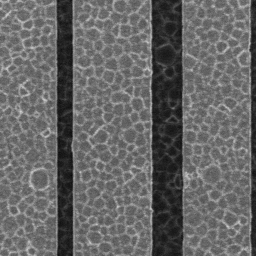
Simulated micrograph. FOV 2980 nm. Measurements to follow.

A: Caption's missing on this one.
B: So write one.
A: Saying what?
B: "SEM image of one or a few lines or trenches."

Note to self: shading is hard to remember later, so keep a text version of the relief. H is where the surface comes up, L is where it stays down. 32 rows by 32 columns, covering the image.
HHHHHHHLLHHHHHHHHHHLLLLHHHHHHHHL
HHHHHHHLLHHHHHHHHHHLLLLHHHHHHHHL
HHHHHHHLLHHHHHHHHHHLLLLHHHHHHHHL
HHHHHHHLLHHHHHHHHHHLLLLHHHHHHHHL
HHHHHHHLLHHHHHHHHHHLLLLHHHHHHHHL
HHHHHHHLLHHHHHHHHHHLLLLHHHHHHHHL
HHHHHHHLLHHHHHHHHHHLLLLHHHHHHHHL
HHHHHHHLLHHHHHHHHHHLLLLHHHHHHHHL
HHHHHHHLLHHHHHHHHHHLLLLHHHHHHHHL
HHHHHHHLLHHHHHHHHHHLLLLHHHHHHHHL
HHHHHHHLLHHHHHHHHHHLLLLHHHHHHHHL
HHHHHHHLLHHHHHHHHHHLLLLHHHHHHHHL
HHHHHHHLLHHHHHHHHHHLLLLHHHHHHHHL
HHHHHHHLLHHHHHHHHHHLLLLHHHHHHHHL
HHHHHHHLLHHHHHHHHHHLLLLHHHHHHHHL
HHHHHHHLLHHHHHHHHHHLLLLHHHHHHHHL
HHHHHHHLLHHHHHHHHHHLLLLHHHHHHHHL
HHHHHHHLLHHHHHHHHHHLLLLHHHHHHHHL
HHHHHHHLLHHHHHHHHHHLLLLHHHHHHHHL
HHHHHHHLLHHHHHHHHHHLLLLHHHHHHHHL
HHHHHHHLLHHHHHHHHHHLLLLHHHHHHHHL
HHHHHHHLLHHHHHHHHHHLLLLHHHHHHHHL
HHHHHHHLLHHHHHHHHHHLLLLHHHHHHHHL
HHHHHHHLLHHHHHHHHHHLLLLHHHHHHHHL
HHHHHHHLLHHHHHHHHHHLLLLHHHHHHHHL
HHHHHHHLLHHHHHHHHHHLLLLHHHHHHHHL
HHHHHHHLLHHHHHHHHHHLLLLHHHHHHHHL
HHHHHHHLLHHHHHHHHHHLLLLHHHHHHHHL
HHHHHHHLLHHHHHHHHHHLLLLHHHHHHHHL
HHHHHHHLLHHHHHHHHHHLLLLHHHHHHHHL
HHHHHHHLLHHHHHHHHHHLLLLHHHHHHHHL
HHHHHHHLLHHHHHHHHHHLLLLHHHHHHHHL